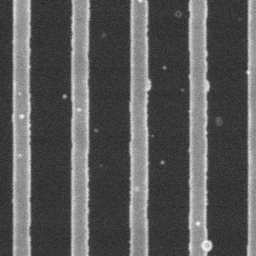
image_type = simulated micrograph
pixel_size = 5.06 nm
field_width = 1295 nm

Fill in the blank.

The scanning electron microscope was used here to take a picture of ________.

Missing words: lines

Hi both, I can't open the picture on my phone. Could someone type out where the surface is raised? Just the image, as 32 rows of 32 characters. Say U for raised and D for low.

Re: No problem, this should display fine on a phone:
DDUUDDDDDUUDDDDDUUDDDDDDUUDDDDDU
DDUUDDDDDUUDDDDDUUDDDDDDUUDDDDDU
DDUUDDDDDUUDDDDDUUDDDDDDUUDDDDDU
DDUUDDDDDUUDDDDDUUDDDDDDUUDDDDDU
DDUUDDDDDUUDDDDDUUDDDDDDUUDDDDDU
DDUUDDDDDUUDDDDDUUDDDDDDUUDDDDDU
DDUUDDDDDUUDDDDDUUDDDDDDUUDDDDDU
DDUUDDDDDUUDDDDDUUDDDDDDUUDDDDDU
DDUUDDDDDUUDDDDDUUDDDDDDUUDDDDDU
DDUUDDDDDUUDDDDDUUDDDDDDUUDDDDDU
DDUUDDDDDUUDDDDDUUUDDDDDUUDDDDDU
DDUUDDDDDUUDDDDDUUDDDDDDUUDDDDDU
DDUUDDDDDUUDDDDDUUDDDDDDUUDDDDDU
DDUUDDDDDUUDDDDDUUDDDDDDUUDDDDDU
DDUUDDDDDUUDDDDDUUDDDDDDUUDDDDDU
DDUUDDDDDUUDDDDDUUDDDDDDUUDDDDDU
DDUUDDDDDUUDDDDDUUDDDDDDUUDDDDDU
DDUUDDDDDUUDDDDDUUDDDDDDUUDDDDDU
DDUUDDDDDUUDDDDDUUDDDDDDUUDDDDDU
DDUUDDDDDUUDDDDDUUDDDDDDUUDDDDDU
DDUUDDDDDUUDDDDDUUDDDDDDUUDDDDDU
DDUUDDDDDUUDDDDDUUDDDDDDUUDDDDDU
DDUUDDDDDUUDDDDDUUDDDDDDUUDDDDDU
DDUUDDDDDUUDDDDDUUDDDDDDUUDDDDDU
DDUUDDDDDUUDDDDDUUDDDDDDUUDDDDDU
DDUUDDDDDUUDDDDDUUDDDDDDUUDDDDDU
DDUUDDDDDUUDDDDDUUDDDDDDUUDDDDDU
DDUUDDDDDUUDDDDDUUDDDDDDUUDDDDDU
DDUUDDDDDUUDDDDDUUDDDDDDUUDDDDDU
DDUUDDDDDUUDDDDDUUDDDDDDUUDDDDDU
DDUUDDDDDUUDDDDDUUDDDDDDUUDDDDDU
DDUUDDDDDUUDDDDDUUDDDDDDUUDDDDDU